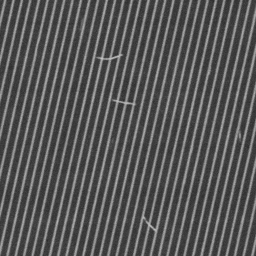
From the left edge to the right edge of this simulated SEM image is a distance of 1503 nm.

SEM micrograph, parallel lines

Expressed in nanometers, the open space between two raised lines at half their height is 36.5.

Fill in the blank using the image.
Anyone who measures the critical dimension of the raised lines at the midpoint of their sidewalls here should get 10.8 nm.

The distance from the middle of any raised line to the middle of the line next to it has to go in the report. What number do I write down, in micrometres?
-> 0.0483